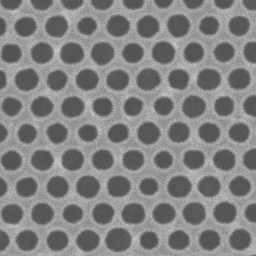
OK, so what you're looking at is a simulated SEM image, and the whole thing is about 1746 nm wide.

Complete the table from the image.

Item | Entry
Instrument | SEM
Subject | a regular array of holes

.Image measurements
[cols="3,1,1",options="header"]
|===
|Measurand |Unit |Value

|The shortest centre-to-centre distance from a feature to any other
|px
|30.2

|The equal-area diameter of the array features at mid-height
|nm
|153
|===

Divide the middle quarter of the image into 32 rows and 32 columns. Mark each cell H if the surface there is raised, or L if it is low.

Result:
HHHHHHHHHLHHHHHHHHHHHHHHHHHHHHHH
HHHHLLLHHHHHHLLHHHHHLLLHHHHLLLHH
LHHLLLLLHHHLLLLLHHLLLLLLHHLLLLLH
LHHLLLLLLHHLLLLLLHLLLLLLHHLLLLLH
LHHLLLLLLHLLLLLLHHLLLLLLHHLLLLLH
HHHLLLLLHHHLLLLLHHLLLLLLHHLLLLLH
HHHHHLLHHHHHLLLHHHHHLLHHHHHHHLHH
HHHHHHHHHHHHHHHHHHHHHHHHHHHHHHHH
LLLLHHHHHLLHHHHHLLHHHHHHLLLHHHLL
LLLLLHHLLLLLHHHLLLLLHHLLLLLHHHLL
LLLLLHHLLLLLHHHLLLLLHHLLLLLLHLLL
LLLLLHHLLLLLHHHLLLLLHHHLLLLHHHLL
LLLLHHHHLLLLHHHLLLLHHHHLLLHHHHLL
HLHHHHHHHHHHHHHHHHHHHHHHHHHHHHHL
HHHHHHHHHHHHHHHHHHHHLLHHHHHHLHHH
HHHHLLLLHHHHLLLLHHHLLLLLHHLLLLLH
LHHHLLLLHHHLLLLLHHLLLLLLHHLLLLLL
LHHHLLLLLHHLLLLLHHLLLLLLHHLLLLLL
LHHHLLLLHHHLLLLLHHLLLLLLHHLLLLLH
HHHHHLLHHHHHLLHHHHHLLLLHHHHLLLHH
HHHHHHHHHHHHHHHHHHHHHHHHHHHHHHHH
HLLLHHHHHLLHHHHHLLHHHHHHHHHHHHHH
LLLLLHHLLLLLHHHLLLLLHHHLLLLHHHLL
LLLLLHHLLLLLHHLLLLLLHHLLLLLHHHLL
LLLLLHHLLLLLLHLLLLLLHHLLLLLHHHLL
LLLLLHHLLLLLHHHLLLLLHHHLLLLHHHLL
HLLLHHHHHLHHHHHHLLHHHHHHHHHHHHHH
HHHHHHHHHHHHHHHHHHHHHHHHHHHHHHHH
HHHHLLLLHHHHLLLLHHHHLLHHHHHLLLLH
LHHLLLLLLHHLLLLLLHHLLLLHHHLLLLLL
LHHLLLLLLHHLLLLLLHHLLLLLHHLLLLLL
LHHLLLLLLHHLLLLLLHHLLLLLHHLLLLLL